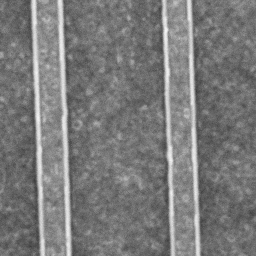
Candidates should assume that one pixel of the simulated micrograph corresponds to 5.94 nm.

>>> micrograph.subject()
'one or a few lines or trenches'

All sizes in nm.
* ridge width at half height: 162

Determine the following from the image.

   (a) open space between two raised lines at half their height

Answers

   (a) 610 nanometers